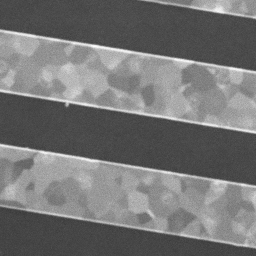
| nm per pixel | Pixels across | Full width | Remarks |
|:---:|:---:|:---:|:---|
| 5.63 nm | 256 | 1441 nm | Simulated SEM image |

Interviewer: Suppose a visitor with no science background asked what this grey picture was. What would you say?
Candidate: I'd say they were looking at one or a few lines or trenches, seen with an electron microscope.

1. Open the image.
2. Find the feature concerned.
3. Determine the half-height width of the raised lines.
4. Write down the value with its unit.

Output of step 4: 336 nm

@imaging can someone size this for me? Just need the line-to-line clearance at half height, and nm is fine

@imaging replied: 302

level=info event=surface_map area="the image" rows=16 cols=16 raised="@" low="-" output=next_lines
------------@@@@
----------------
@@@@------------
@@@@@@@@@@------
@@@@@@@@@@@@@@@@
@@@@@@@@@@@@@@@@
-----@@@@@@@@@@@
-----------@@@@@
----------------
@@@-------------
@@@@@@@@@-------
@@@@@@@@@@@@@@@-
@@@@@@@@@@@@@@@@
----@@@@@@@@@@@@
----------@@@@@@
----------------